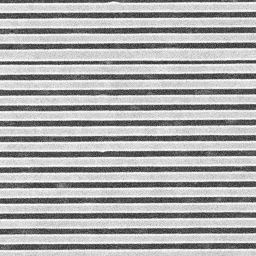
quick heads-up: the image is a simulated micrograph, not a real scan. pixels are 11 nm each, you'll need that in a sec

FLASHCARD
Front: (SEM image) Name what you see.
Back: parallel lines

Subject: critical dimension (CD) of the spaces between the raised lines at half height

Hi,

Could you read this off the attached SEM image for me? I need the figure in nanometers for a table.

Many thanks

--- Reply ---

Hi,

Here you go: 78.4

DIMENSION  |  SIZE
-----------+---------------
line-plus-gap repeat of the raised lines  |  170 nm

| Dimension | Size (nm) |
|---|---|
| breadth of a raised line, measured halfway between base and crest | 90.8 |